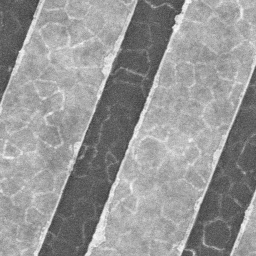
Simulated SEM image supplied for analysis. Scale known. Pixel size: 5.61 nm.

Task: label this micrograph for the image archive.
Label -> one or a few lines or trenches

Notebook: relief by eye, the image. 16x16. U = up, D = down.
DDUUUUUUDDDUUUUU
DDUUUUUUDDDUUUUU
DDUUUUUUDDDUUUUU
DUUUUUUDDDUUUUUU
DUUUUUUDDDUUUUUU
UUUUUUDDDUUUUUUD
UUUUUUDDDUUUUUUD
UUUUUUDDDUUUUUUD
UUUUUDDDUUUUUUDD
UUUUUDDDUUUUUUDD
UUUUUDDDUUUUUDDD
UUUUDDDUUUUUUDDD
UUUUDDDUUUUUUDDD
UUUDDDUUUUUUDDDU
UUUDDDUUUUUUDDDU
UUDDDDUUUUUDDDDU